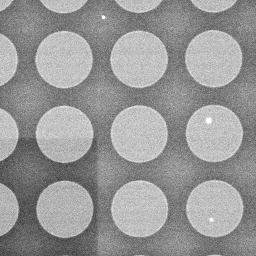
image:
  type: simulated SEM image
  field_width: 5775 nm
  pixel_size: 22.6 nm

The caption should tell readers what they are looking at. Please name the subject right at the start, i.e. an array of small figures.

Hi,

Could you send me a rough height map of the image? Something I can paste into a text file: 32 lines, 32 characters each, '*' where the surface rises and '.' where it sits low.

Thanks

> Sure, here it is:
*....*****.....*****....*****...
.......**........*..............
................................
................................
......****.....****......****...
**...******...******....******..
**...******...*******..*******..
**...******...*******..*******..
**...******...*******..*******..
**...******....*****....*****...
......****......***......***....
................................
................................
.......**.......***......***....
*....******....*****....*****...
**...******...*******...******..
**...*******..*******..*******..
**...******...*******..*******..
**...******...******....******..
*.....****.....*****.....****...
................................
................................
................................
*.....****.....*****....*****...
**...******...*******...******..
**...*******..*******..*******..
**...*******..*******..*******..
**...******...*******...******..
*.....*****....*****....*****...
.......**........*..............
................................
................................